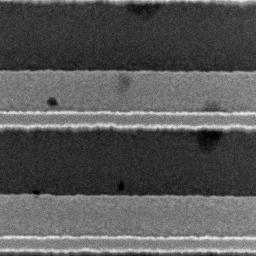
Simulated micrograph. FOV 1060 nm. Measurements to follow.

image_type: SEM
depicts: lines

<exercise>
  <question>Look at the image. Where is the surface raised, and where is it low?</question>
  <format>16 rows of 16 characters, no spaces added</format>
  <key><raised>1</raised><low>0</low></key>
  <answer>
0000000000000000
0000000000000000
0000000000000000
0000000000000000
1111111111111111
1111111111111111
1111111111111111
1111111111111111
0000000000000000
0000000000000000
0000000000000000
0000000000000000
1111111111111111
1111111111111111
1111111111111111
1111111111111111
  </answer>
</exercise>